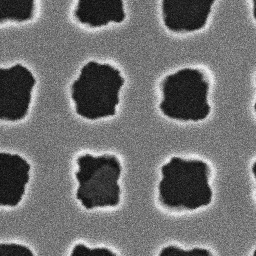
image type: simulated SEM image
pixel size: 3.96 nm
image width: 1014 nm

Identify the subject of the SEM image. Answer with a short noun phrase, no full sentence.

holes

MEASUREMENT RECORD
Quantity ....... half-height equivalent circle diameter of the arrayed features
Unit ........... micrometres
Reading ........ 0.21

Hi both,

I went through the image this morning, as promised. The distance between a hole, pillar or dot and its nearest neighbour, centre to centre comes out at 346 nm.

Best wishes